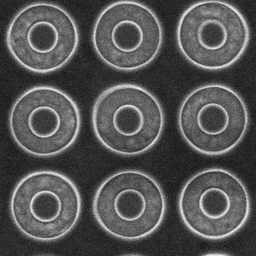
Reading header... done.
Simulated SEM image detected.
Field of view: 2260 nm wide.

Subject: an array of small figures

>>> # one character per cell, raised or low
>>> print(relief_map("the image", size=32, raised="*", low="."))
***************..********...****
***.....*****......****......***
**.......***.......****.......**
*...***..***..***...**...***...*
*...***...**..****..**...***...*
*...***..***..***...***..***...*
**...*...***.......****.......**
**......*****......*****.....***
****...*************************
********************************
********************************
****...*******....******.....***
***......****......****.......**
**...*...***...**...***..***..**
**..***...**..****..***..***...*
*...***...**..****..***..***...*
**..***..***...**...***...**..**
**.......****......*****......**
***.....******....*******....***
********************************
********************************
**************************..****
***.....******.....*****.....***
**.......****.......***.......**
**..***...**...***..***..***...*
**..****..**..****..***..****..*
**..***...**...***..***...**...*
**...*...***........***.......**
***......****......*****......**
****...********..*********..****
********************************
********************************